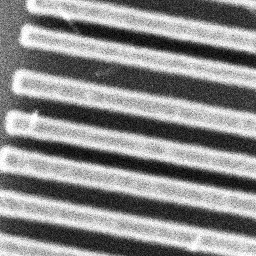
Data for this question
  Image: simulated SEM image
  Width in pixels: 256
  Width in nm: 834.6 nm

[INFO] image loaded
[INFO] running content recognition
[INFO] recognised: parallel lines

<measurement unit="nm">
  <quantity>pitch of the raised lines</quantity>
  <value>133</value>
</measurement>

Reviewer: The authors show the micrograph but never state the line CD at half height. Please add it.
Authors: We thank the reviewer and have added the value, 21.7 pixels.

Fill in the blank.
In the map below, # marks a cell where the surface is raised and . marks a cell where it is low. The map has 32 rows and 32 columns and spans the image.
....#########................###
....##############..............
..........##############........
...##..........#############....
...#######..........############
...############...........######
........#############..........#
.............#############......
...................############.
..####..................########
..#########..................###
..##############................
.......###############..........
.............##############.....
.####.............##############
.#########.............#########
.##############.............####
......##############............
...........###############......
######..........###############.
###########...........##########
..###############..........#####
.......###############..........
............###############.....
###..............###############
#########..............#########
##############...............###
....################............
..........###############.......
#..............###############..
######...............###########
###########...............######